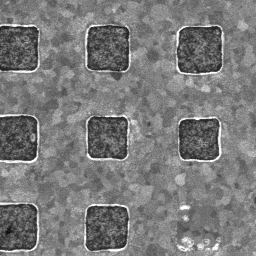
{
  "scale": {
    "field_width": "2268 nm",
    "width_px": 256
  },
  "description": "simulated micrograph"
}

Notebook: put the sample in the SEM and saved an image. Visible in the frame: holes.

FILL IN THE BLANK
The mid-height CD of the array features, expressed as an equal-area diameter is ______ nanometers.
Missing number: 432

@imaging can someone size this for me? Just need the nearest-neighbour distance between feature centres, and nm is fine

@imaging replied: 788